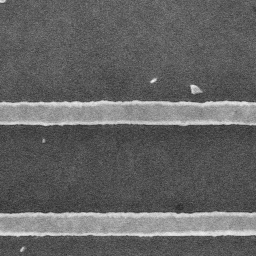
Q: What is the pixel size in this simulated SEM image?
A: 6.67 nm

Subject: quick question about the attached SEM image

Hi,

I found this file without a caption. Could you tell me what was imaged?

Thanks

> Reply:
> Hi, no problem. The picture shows lines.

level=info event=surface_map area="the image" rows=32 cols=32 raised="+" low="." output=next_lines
................................
................................
................................
................................
................................
................................
................................
................................
................................
................................
................................
................................
................................
++++++++++++++++++++++++++++++++
++++++++++++++++++++++++++++++++
++.++++++++++.....++++++++.+++++
................................
................................
................................
................................
................................
................................
................................
................................
................................
................................
................................
++++++++++++++++++++++++++++++++
++++++++++++++++++++++++++++++++
................................
................................
................................